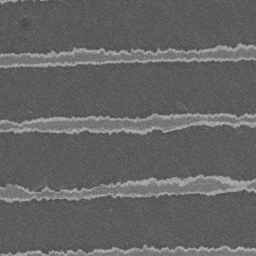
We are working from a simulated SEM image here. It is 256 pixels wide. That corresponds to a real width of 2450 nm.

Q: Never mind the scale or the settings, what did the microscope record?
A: one or a few lines or trenches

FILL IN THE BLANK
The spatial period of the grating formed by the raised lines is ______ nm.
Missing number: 636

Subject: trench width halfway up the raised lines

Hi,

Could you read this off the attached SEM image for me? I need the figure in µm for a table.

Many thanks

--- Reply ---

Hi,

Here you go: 0.523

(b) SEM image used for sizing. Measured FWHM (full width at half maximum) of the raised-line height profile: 109 nm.